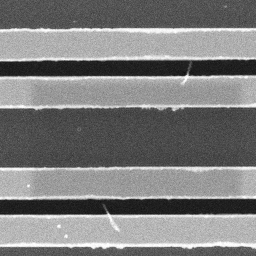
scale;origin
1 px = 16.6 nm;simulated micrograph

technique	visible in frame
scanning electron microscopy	lines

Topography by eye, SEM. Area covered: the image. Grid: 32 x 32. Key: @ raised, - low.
--------------------------------
--------------------------------
--------------------------------
--------------------------------
@@@@@@@@@@@@@@@@@@@@@@@@@@@@@@@@
@@@@@@@@@@@@@@@@@@@@@@@@@@@@@@@@
@@@@@@@@@@@@@@@@@@@@@@@@@@@@@@@@
@@@@@@@@-@----------------------
--------------------------------
-----------------------@--@@@@@@
@@@@@@@@@@@@@@@@@@@@@@@@@@@@@@@@
@@@@@@@@@@@@@@@@@@@@@@@@@@@@@@@@
@@@@@@@@@@@@@@@@@@@@@@@@@@@@@@@@
--------------------------------
--------------------------------
--------------------------------
--------------------------------
--------------------------------
--------------------------------
--------------------------------
--------------------------------
@@@@@@@@@@@@@@@@@@@@@@@@@@@@@@@@
@@@@@@@@@@@@@@@@@@@@@@@@@@@@@@@@
@@@@@@@@@@@@@@@@@@@@@@@@@@@@@@@@
@@@@@@@@@@@@@@@@@@@@@@@@@@@@@@@@
--------------------------------
--------------------------------
@@@@@@@@@@@@@@@@@@@@@@@@@@@@@@@@
@@@@@@@@@@@@@@@@@@@@@@@@@@@@@@@@
@@@@@@@@@@@@@@@@@@@@@@@@@@@@@@@@
@@@@@@@@@@@@@@@@@@@@@@@@@@@@@@@@
--------------------------------